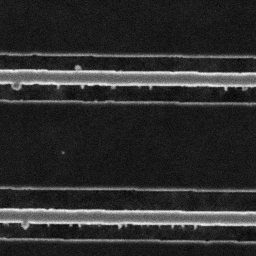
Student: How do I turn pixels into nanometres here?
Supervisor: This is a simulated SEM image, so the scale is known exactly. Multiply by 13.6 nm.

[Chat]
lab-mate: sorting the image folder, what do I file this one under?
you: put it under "lines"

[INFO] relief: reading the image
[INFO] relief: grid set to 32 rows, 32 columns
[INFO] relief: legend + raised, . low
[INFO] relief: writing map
++++++++++++++++++++++++++++++++
++++++++++++++++++++++++++++++++
++++++++++++++++++++++++++++++++
++++++++++++++++++++++++++++++++
++++++++++++++++++++++++++++++++
++++++++++++++++++++++++++++++++
++++++++++++++++++++++++++++++++
................................
................................
++++++++++++++++++++++++++++++++
.+++.+++++++++++++++++++++++++++
................................
................................
++++++++++++++++++++++++++++++++
++++++++++++++++++++++++++++++++
++++++++++++++++++++++++++++++++
++++++++++++++++++++++++++++++++
++++++++++++++++++++++++++++++++
++++++++++++++++++++++++++++++++
++++++++++++++++++++++++++++++++
++++++++++++++++++++++++++++++++
++++++++++++++++++++++++++++++++
++++++++++++++++++++++++++++++++
++++++++++++++++++++++++++++++++
................................
................................
+++++++++++++++++++++++.........
++++++++++++++++++++++++++++++++
................................
................................
++++++++++++++++++++++++++++++++
++++++++++++++++++++++++++++++++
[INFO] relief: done